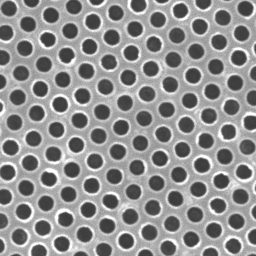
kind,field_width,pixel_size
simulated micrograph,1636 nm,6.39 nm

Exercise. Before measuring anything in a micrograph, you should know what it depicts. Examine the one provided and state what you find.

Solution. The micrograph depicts a regular array of holes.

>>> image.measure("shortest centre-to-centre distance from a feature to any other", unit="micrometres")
0.155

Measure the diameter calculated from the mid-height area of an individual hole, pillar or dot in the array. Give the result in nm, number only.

98.8